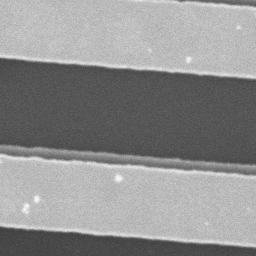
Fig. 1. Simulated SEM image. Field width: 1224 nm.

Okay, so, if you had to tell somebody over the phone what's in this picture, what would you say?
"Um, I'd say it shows lines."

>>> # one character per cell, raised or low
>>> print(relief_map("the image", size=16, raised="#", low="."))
################
################
################
################
...........#####
................
................
................
................
................
##########......
################
################
################
....############
................